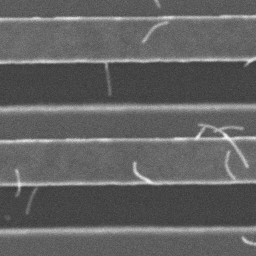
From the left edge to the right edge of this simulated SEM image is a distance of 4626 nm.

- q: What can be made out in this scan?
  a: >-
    lines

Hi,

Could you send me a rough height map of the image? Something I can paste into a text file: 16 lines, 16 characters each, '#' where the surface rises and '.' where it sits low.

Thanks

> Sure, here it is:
################
################
################
################
................
................
................
################
################
################
################
#####...........
................
................
################
################